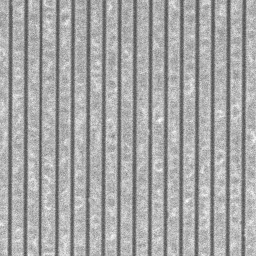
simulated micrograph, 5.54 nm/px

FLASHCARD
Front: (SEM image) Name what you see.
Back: parallel lines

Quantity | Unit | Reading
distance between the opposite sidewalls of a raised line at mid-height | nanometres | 63.7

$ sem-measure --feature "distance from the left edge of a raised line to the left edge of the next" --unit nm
86.1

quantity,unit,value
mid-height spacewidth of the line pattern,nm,21.4